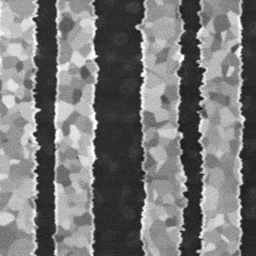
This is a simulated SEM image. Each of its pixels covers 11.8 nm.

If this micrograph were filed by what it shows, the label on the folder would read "one or a few lines or trenches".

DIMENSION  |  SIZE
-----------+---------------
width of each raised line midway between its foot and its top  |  0.431 µm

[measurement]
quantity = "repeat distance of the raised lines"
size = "862 nanometers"